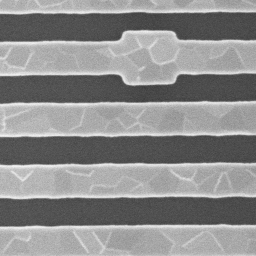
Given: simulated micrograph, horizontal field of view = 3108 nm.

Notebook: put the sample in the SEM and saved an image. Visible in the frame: wiring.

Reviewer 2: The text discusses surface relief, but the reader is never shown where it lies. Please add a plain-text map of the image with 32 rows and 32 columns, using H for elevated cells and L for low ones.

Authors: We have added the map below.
HHHHHHHHHHHHHHHHHHHHHHHHHHHHHHHH
HHHHHHHHHHHHHHHHLLHHHHLLLLLLLLLL
LLLLLLLLLLLLLLLLLLLLLLLLLLLLLLLL
LLLLLLLLLLLLLLLLLLLLLLLLLLLLLLLL
LLLLLLLLLLLLLLLHHHHHHHLLLLLLLLLL
HHHHHHHHHHHHHHHHHHHHHHHHHHHHHHHH
HHHHHHHHHHHHHHHHHHHHHHHHHHHHHHHH
HHHHHHHHHHHHHHHHHHHHHHHHHHHHHHHH
HHHHHHHHHHHHHHHHHHHHHHHHHHHHHHHH
LLLLLLLLLLLLLLLHHHHHHHLLLLLLLLLL
LLLLLLLLLLLLLLLLHHHHLLLLLLLLLLLL
LLLLLLLLLLLLLLLLLLLLLLLLLLLLLLLL
LLLLLLLLLLLLLLLLLLLLLLLLLLLLLLLL
HHHHHHHHHHHHHHHHHHHHHHHHHHHHHHHH
HHHHHHHHHHHHHHHHHHHHHHHHHHHHHHHH
HHHHHHHHHHHHHHHHHHHHHHHHHHHHHHHH
HHHHHHHHHHHHHHHHHHHHHHHHHHHHHHHH
LLLLLLLLLLLLLLLLLLLLLLLLLLLLLLLL
LLLLLLLLLLLLLLLLLLLLLLLLLLLLLLLL
LLLLLLLLLLLLLLLLLLLLLLLLLLLLLLLL
LLLLLLLLLLLLLLLLLLLLLLLLLHHHHHHH
HHHHHHHHHHHHHHHHHHHHHHHHHHHHHHHH
HHHHHHHHHHHHHHHHHHHHHHHHHHHHHHHH
HHHHHHHHHHHHHHHHHHHHHHHHHHHHHHHH
HHHHHHHHHHHHHHHHHHHHHLLLHHHHHLHH
LLLLLLLLLLLLLLLLLLLLLLLLLLLLLLLL
LLLLLLLLLLLLLLLLLLLLLLLLLLLLLLLL
LLLLLLLLLLLLLLLLLLLLLLLLLLLLLLLL
HHHHHHHHHHHHHHHHHHHHHHHHHHHHHHHH
HHHHHHHHHHHHHHHHHHHHHHHHHHHHHHHH
HHHHHHHHHHHHHHHHHHHHHHHHHHHHHHHH
HHHHHHHHHHHHHHHHHHHHHHHHHHHHHHHH